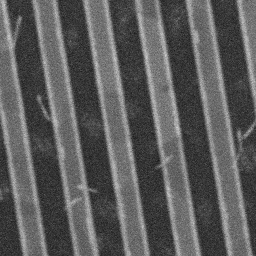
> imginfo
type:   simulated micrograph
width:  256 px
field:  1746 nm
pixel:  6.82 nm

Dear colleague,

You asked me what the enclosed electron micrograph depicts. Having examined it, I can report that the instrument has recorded parallel lines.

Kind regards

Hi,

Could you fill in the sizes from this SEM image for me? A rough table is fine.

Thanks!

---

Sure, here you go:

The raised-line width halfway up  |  0.13 µm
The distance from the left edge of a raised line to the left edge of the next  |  0.344 micrometres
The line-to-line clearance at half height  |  209 nm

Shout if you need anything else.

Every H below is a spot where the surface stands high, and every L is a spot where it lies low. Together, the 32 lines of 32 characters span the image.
LLLLHHHLLLLHHLLLLHHHLLLLHHLLLLHH
HLLLLHHLLLLHHLLLLHHHLLLLHHLLLLHH
HLLLLHHLLLLHHLLLLHHHLLLLHHLLLLHH
HLLLLHHLLLLHHHLLLLHHLLLLHHHLLLHH
HLLLLHHHLLLHHHLLLLHHLLLLHHHLLLLH
HLLLLHHHLLLLHHLLLLHHHLLLHHHLLLLH
HHLLLHHHLLLLHHLLLLHHHLLLLHHLLLLH
HHLLLLHHLLLLHHLLLLHHHLLLLHHLLLLH
HHLLLLHHLLLLHHHLLLHHHLLLLHHLLLLH
HHLLLLHHLLLLHHHLLLLHHLLLLHHLLLLH
HHLLLLHHHLLLHHHLLLLHHLLLLHHHLLLL
HHLLLLHHHLLLLHHLLLLHHHLLLHHHLLLL
HHLLLLHHHLLLLHHLLLLHHHLLLLHHLLLL
HHHLLLLHHLLLLHHLLLLHHHLLLLHHLLLL
HHHLLLLHHLLLLHHHLLLHHHLLLLHHLLLL
LHHLLLLHHLLLLHHHLLLLHHLLLLHHHLLL
LHHLLLLHHHLLLHHHLLLLHHLLLLHHHLLL
LHHLLLLHHHLLLLHHLLLLHHLLLLHHHLLL
LHHLLLLHHHLLLLHHLLLLHHHLLLLHHLLL
LHHHLLLLHHLLLLHHLLLLHHHLLLLHHLLL
LHHHLLLLHHLLLLHHHLLLHHHLLLLHHLLL
LLHHLLLLHHLLLLHHHLLLLHHLLLLHHLLL
LLHHLLLLHHLLLLHHHLLLLHHLLLLHHHLL
LLHHLLLLHHHLLLLHHLLLLHHLLLLHHHLL
LLHHLLLLHHHLLLLHHLLLLHHHLLLLHHLL
LLHHHLLLHHHLLLLHHLLLLHHHLLLLHHLL
LLHHHLLLLHHLLLLHHHLLLHHHLLLLHHLL
LLLHHLLLLHHLLLLHHHLLLLHHLLLLHHHL
LLLHHLLLLHHLLLLHHHLLLLHHLLLLHHHL
LLLHHLLLLHHHLLLLHHLLLLHHLLLLHHHL
LLLHHLLLLHHHLLLLHHLLLLHHHLLLLHHL
LLLHHHLLLLHHLLLLHHLLLLHHHLLLLHHL